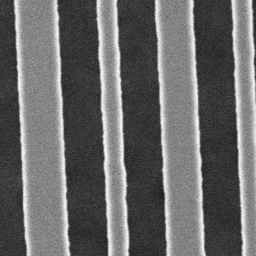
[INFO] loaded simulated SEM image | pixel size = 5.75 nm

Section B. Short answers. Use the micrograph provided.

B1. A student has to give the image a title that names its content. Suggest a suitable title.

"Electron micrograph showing lines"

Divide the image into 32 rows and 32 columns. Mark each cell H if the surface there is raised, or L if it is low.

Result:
LLHHHHHLLLLLHHLLLLLHHHHHLLLLLHHL
LLHHHHHLLLLLHHHLLLLHHHHHLLLLLHHH
LLHHHHHLLLLLHHHLLLLHHHHHLLLLLHHH
LLHHHHHLLLLLHHHLLLLLHHHHLLLLLHHH
LLHHHHHLLLLLHHHLLLLLHHHHLLLLLHHH
LLHHHHHLLLLLHHHLLLLLHHHHLLLLLHHH
LLHHHHHLLLLLHHHLLLLLHHHHLLLLLHHH
LLHHHHHHLLLLHHHLLLLLHHHHLLLLLHHH
LLHHHHHHLLLLHHHLLLLLHHHHLLLLLHHH
LLHHHHHHLLLLLHHLLLLLHHHHLLLLLHHH
LLHHHHHHLLLLLHHLLLLLHHHHHLLLLHHH
LLHHHHHHLLLLLHHLLLLLHHHHHLLLLLHH
LLHHHHHHLLLLLHHLLLLLHHHHHLLLLLHH
LLLHHHHHLLLLLHHLLLLLHHHHHLLLLLHH
LLLHHHHHLLLLLHHLLLLLHHHHHLLLLLHH
LLLHHHHHLLLLLHHLLLLLHHHHHLLLLLHH
LLLHHHHHLLLLLHHLLLLLHHHHHLLLLLHH
LLLHHHHHLLLLLHHLLLLLHHHHHLLLLLHH
LLLHHHHHLLLLLHHLLLLLHHHHHLLLLLHH
LLLHHHHHLLLLLHHLLLLLHHHHHLLLLLHH
LLLHHHHHLLLLLHHLLLLLHHHHHLLLLLHH
LLLHHHHHLLLLLHHHLLLLHHHHHLLLLLHH
LLLHHHHHLLLLLHHHLLLLHHHHHLLLLLHH
LLLHHHHHLLLLLHHHLLLLLHHHHLLLLLHH
LLLHHHHHLLLLLHHHLLLLLHHHHLLLLLHH
LLLHHHHHLLLLLHHHLLLLLHHHHLLLLLHH
LLLHHHHHLLLLLHHHLLLLLHHHHLLLLLHH
LLLHHHHHLLLLLHHHLLLLLHHHHLLLLLHH
LLLHHHHHLLLLLHHHLLLLLHHHHLLLLLHH
LLLHHHHHLLLLLHHHLLLLLHHHHLLLLLHH
LLLHHHHHLLLLLLHHLLLLLHHHHLLLLLHH
LLLHHHHHHLLLLLHHLLLLLHHHHHLLLLHH